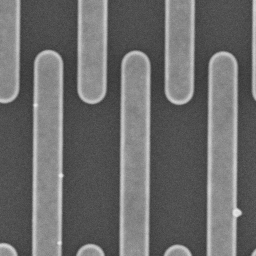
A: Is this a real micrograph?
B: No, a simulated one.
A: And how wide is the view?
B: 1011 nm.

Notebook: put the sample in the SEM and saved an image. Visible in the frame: groups of lines, slits or small figures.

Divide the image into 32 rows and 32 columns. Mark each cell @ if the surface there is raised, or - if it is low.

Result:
@@--------@@@--------@@@--------
@@--------@@@--------@@@--------
@@--------@@@--------@@@--------
@@--------@@@--------@@@--------
@@--------@@@--------@@@--------
@@--------@@@--------@@@--------
@@---@@---@@@--------@@@--------
@@--@@@@--@@@--@@@@--@@@--@@@---
@@--@@@@--@@@--@@@@--@@@--@@@@--
@@--@@@@--@@@--@@@@--@@@--@@@@--
@@--@@@@--@@@--@@@@--@@@--@@@@--
@@--@@@@--@@@--@@@@--@@@--@@@@--
@@--@@@@--@@@--@@@@--@@@--@@@@--
----@@@@-------@@@@-------@@@@--
----@@@@-------@@@@-------@@@@--
----@@@@-------@@@@-------@@@@--
----@@@@-------@@@@-------@@@@--
----@@@@-------@@@@-------@@@@--
----@@@@-------@@@@-------@@@@--
----@@@@-------@@@@-------@@@@--
----@@@@-------@@@@-------@@@@--
----@@@@-------@@@@-------@@@@--
----@@@@-------@@@@-------@@@@--
----@@@@-------@@@@-------@@@---
----@@@@-------@@@@-------@@@---
----@@@@-------@@@@-------@@@---
----@@@@-------@@@@-------@@@@--
----@@@@-------@@@@-------@@@@--
----@@@@-------@@@@-------@@@---
----@@@@-------@@@@-------@@@---
----@@@@-------@@@@-------@@@---
@@--@@@@--@@@--@@@@--@@@--@@@---